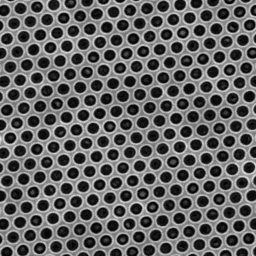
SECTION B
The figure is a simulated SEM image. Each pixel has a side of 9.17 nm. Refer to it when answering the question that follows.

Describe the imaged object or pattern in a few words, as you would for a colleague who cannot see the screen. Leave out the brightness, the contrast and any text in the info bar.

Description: a regular array of holes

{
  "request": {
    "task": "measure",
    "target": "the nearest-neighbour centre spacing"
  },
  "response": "0.148 µm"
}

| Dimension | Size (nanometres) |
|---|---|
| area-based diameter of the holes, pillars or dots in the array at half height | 112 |